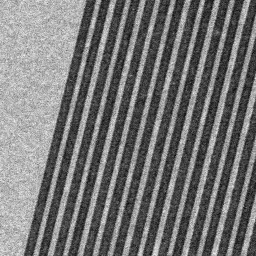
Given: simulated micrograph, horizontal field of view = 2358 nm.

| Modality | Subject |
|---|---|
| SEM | parallel lines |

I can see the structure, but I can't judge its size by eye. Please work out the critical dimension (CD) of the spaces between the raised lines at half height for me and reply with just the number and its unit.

0.094 microns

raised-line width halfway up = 42.5 nanometers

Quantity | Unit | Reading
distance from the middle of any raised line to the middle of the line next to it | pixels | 14.4